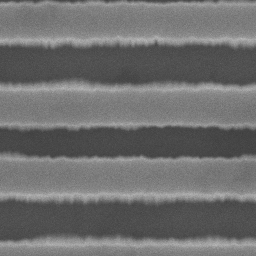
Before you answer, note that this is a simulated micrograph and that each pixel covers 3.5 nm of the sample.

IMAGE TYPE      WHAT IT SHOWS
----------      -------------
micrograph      lines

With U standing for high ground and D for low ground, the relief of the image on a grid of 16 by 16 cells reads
UUUUUUUUUUUUUUUU
UUUUUUUUUUUUUUUU
UUUUUUUUUUUUUUUU
DDDDDDDDDDDDDDDD
DDDDDDDDDDDDDDDD
UUUUUUUUUUUUUUUU
UUUUUUUUUUUUUUUU
UUUUUUUUUUUUUUUU
DDDDDDDDDDDDDDDD
DDDDDDDDDDDDDDDD
UUUUUUUUUUUUUUUU
UUUUUUUUUUUUUUUU
DDDDDDDDDDDDDDDD
DDDDDDDDDDDDDDDD
DDDDDDDDDDDDDDDD
UUUUUUUUUUUUUUUU